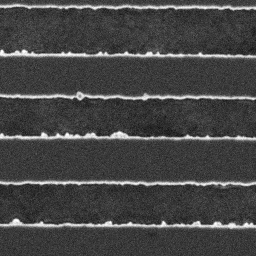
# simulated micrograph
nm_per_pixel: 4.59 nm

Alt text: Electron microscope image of lines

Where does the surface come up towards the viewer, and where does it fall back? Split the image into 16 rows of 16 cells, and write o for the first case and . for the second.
....oooooooooooo
................
................
ooooooooooooooo.
oooooooooooooooo
oooooooooooooooo
................
................
................
oooooooooooooooo
oooooooooooooooo
o.......oooooooo
................
................
oooooooooooooooo
oooooooooooooooo